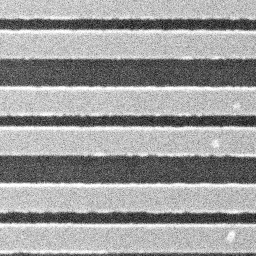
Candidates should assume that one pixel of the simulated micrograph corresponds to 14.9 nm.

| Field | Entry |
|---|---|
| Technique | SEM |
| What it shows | lines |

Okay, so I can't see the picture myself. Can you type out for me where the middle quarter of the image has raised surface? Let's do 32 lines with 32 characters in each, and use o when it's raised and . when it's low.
................................
................................
................................
................................
................................
................................
oooooooooooooooooooooooooooooooo
oooooooooooooooooooooooooooooooo
oooooooooooooooooooooooooooooooo
oooooooooooooooooooooooooooooooo
oooooooooooooooooooooooooooooooo
oooooooooooooooooooooooooooooooo
oooooooooooooooooooooooooooooooo
................................
................................
................................
oooooooooooooooooooooooooooooooo
oooooooooooooooooooooooooooooooo
oooooooooooooooooooooooooooooooo
oooooooooooooooooooooooooooooooo
oooooooooooooooooooooooooooooooo
oooooooooooooooooooooooooooooooo
oooooooooooooooooooooooooooooooo
................................
................................
................................
................................
................................
................................
................................
oooooooooooooooooooooooooooooooo
oooooooooooooooooooooooooooooooo